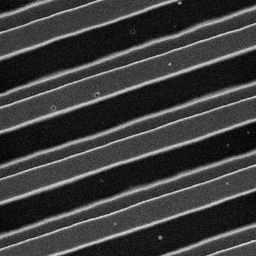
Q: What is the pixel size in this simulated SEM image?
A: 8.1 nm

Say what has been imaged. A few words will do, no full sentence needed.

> lines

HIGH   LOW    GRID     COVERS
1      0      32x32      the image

00000111111111111111000000000000
00111111111111111100000000000011
11111111111111100000000000001111
11111111111000000000000001111111
11111111000000000000001111111111
11111000000000000001111111111111
11000000000000001111111111111100
00000000000001111111111111100000
00000000001111111111111100000000
00000001111111111111100000000000
00001111111111111100000000000000
01111111111111100000000000001111
11111111111100000000000001111111
11111111100000000000001111111111
11111100000000000001111111111111
11100000000000001111111111111100
00000000000000111111111111100000
00000000001111111111111100000000
00000001111111111111100000000000
00001111111111111100000000000001
01111111111111100000000000011111
11111111111100000000000011111111
11111111100000000000011111111111
11111100000000000011111111111111
11100000000000011111111111111100
00000000000011111111111111100000
00000000001111111111111100000000
00000011111111111111100000000000
00001111111111111000000000000001
01111111111111000000000000001111
11111111111000000000000001111111
11111111000000000000001111111111